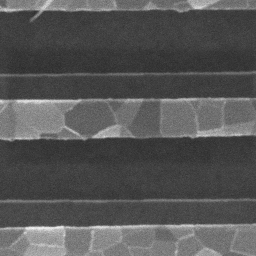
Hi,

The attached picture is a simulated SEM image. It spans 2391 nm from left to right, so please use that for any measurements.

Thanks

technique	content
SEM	lines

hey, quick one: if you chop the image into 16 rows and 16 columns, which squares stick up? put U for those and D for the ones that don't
UUUUUUUUUUUUUUUU
DDDDDDDDDDDDDDDD
DDDDDDDDDDDDDDDD
DDDDDDDDDDDDDDDD
DDDDDDDDDDDDDDDD
UUUUUUUUUUUUUUUU
UUUUUUUUUUUUUUUU
UUUUUUUUUUUUUUUU
UUUUUUUUUUUUUDDD
DDDDDDDDDDDDDDDD
DDDDDDDDDDDDDDDD
DDDDDDDDDDDDDDDD
DDDDDDDDDDDDDUUU
UUUUUUUUUUUUUUUU
UUUUUUUUUUUUUUUU
UUUUUUUUUUUUUUUU